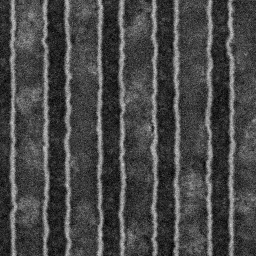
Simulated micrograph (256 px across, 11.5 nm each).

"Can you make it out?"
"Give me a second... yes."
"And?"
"parallel lines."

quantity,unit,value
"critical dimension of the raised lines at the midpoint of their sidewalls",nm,253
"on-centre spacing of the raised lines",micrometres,0.629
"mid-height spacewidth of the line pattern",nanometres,374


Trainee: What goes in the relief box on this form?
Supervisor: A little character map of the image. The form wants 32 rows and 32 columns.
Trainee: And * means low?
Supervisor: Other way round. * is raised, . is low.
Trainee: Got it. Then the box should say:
**....**.....**....***....***...
**....**.....**....***....***...
**....**.....**....***....***...
**....**....***....***....***...
**....**.....**....***....***...
**....***...***....***....***...
**....**....***....***....***...
**....**....***....***....***...
**....**.....**....***....***...
**....**.....**....***....***...
**....**.....**....***....***...
**....**.....**....***....***...
**....**.....**....***....***...
**....***...***....***....***...
**....**....***....***....***...
**....**....***....***....***...
**....***...***....***....***...
**....**.....**....***....***...
**....**....***....***....***...
**....**.....**....***....***...
**....**....***....***....***...
**....**....***....***....***...
**....**....***....***....***...
**....**.....**....***....***...
**....***....**....***....***...
**....***...***....***....***...
**....***....**....***....***...
**....**.....**....***....***...
**....**.....**....***....***...
**....***....**....***....***...
**....***....**....***....***...
**....***...***....***....***...